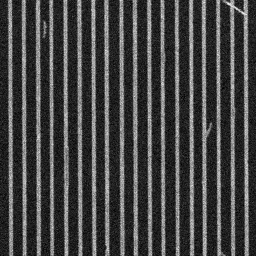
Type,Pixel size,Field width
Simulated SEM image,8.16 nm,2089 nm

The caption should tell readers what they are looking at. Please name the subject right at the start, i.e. parallel lines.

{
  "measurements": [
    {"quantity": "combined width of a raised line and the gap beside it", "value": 113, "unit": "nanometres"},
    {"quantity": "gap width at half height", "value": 84.7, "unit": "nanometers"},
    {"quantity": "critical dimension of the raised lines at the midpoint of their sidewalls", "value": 27.5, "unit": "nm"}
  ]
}